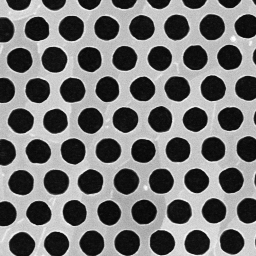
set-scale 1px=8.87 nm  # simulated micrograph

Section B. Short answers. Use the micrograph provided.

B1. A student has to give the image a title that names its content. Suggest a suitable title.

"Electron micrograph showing a regular array of holes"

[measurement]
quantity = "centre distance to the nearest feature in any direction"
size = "0.308 um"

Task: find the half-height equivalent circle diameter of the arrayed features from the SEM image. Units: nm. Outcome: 222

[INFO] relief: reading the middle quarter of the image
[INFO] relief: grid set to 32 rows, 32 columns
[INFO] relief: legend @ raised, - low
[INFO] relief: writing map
@@@@-----@@@@-----@@@@----@@@@@-
@@@@@---@@@@@@--@@@@@@@--@@@@@@@
@@@@@@@@@@@@@@@@@@@@@@@@@@@@@@@@
@--@@@@@@---@@@@@@---@@@@@@---@@
-----@@@-----@@@@-----@@@@-----@
-----@@@------@@@------@@------@
-----@@@------@@-------@@-------
-----@@@------@@@------@@@-----@
-----@@@@----@@@@@----@@@@-----@
@---@@@@@@-@@@@@@@@@@@@@@@@@@@@@
@@@@@@@@@@@@@@@@@@@@@@@@-@@@@@@@
@@@@@----@@@@----@@@@@----@@@@@-
@@@@-----@@@------@@@------@@@--
-@@-------@@-------@@------@@@--
-@@-------@@-------@@------@@@--
-@@@------@@------@@@@-----@@@--
@@@@@----@@@@@---@@@@@----@@@@@-
@@@@@@@@@@@@@@@@@@@@@@@@@@@@@@@@
@@@@@@@@@@--@@@@@@@@@@@@@@@---@@
-----@@@@----@@@@@----@@@@-----@
-----@@@------@@@------@@@-----@
------@@------@@@------@@-------
-----@@@------@@@------@@@-----@
-----@@@------@@@-----@@@@-----@
@---@@@@@----@@@@@@--@@@@@@---@@
@@@@@@@@@@@@@@@@@@@@@@@@@@@@@@@@
@@@@@@--@@@@@@---@@@@@@---@@@@@@
@@@@-----@@@@-----@@@@-----@@@--
-@@@------@@@------@@------@@@--
-@@-------@@-------@@-------@@--
-@@@------@@@-----@@@------@@@--
@@@@-----@@@@-----@@@@-----@@@@-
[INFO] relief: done